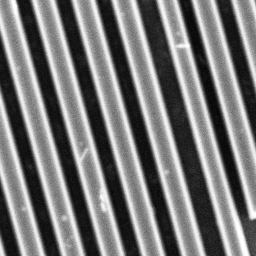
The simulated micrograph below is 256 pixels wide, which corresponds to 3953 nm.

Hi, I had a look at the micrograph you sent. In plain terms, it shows parallel lines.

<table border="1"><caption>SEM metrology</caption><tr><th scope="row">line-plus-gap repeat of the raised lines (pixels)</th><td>38.9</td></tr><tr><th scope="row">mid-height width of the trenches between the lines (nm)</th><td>259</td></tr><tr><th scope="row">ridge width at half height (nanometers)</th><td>333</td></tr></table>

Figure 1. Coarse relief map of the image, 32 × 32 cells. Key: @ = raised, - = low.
@@--@@@--@@@--@@@---@@--@@@--@@@
@@--@@@---@@--@@@---@@@-@@@--@@@
@@@--@@---@@@--@@@--@@@--@@---@@
@@@--@@@--@@@--@@@---@@--@@@--@@
@@@--@@@--@@@--@@@---@@--@@@--@@
-@@---@@---@@---@@---@@@-@@@---@
-@@@--@@@--@@@--@@@---@@--@@@--@
-@@@--@@@--@@@--@@@---@@--@@@--@
-@@@--@@@--@@@--@@@---@@--@@@--@
--@@---@@---@@---@@---@@@--@@---
--@@@--@@@--@@@--@@@---@@--@@@--
--@@@--@@@--@@@--@@@---@@--@@@--
--@@@--@@@---@@--@@@---@@@-@@@--
@--@@@--@@---@@@--@@@--@@@--@@--
@--@@@--@@@--@@@--@@@---@@--@@@-
@--@@@--@@@--@@@--@@@---@@--@@@-
@---@@---@@---@@---@@---@@@-@@@-
@@--@@@--@@@--@@@--@@@---@@--@@@
@@--@@@--@@@--@@@--@@@---@@--@@@
@@--@@@--@@@--@@@--@@@---@@--@@@
@@---@@---@@---@@---@@---@@@--@@
@@@--@@@--@@@--@@@--@@@---@@--@@
@@@--@@@--@@@--@@@--@@@---@@--@@
-@@--@@@--@@@---@@--@@@---@@@-@@
-@@@--@@@--@@---@@@--@@@--@@@--@
-@@@--@@@--@@@--@@@--@@@---@@--@
-@@@--@@@--@@@--@@@--@@@---@@--@
--@@---@@---@@--@@@---@@---@@@--
--@@@--@@@--@@@--@@@--@@@---@@--
--@@@--@@@--@@@--@@@--@@@---@@--
--@@@--@@@--@@@--@@@--@@@---@@--
---@@---@@---@@---@@---@@---@@@-